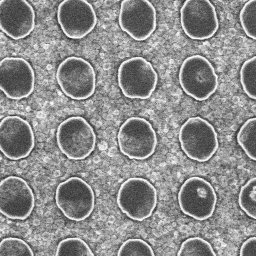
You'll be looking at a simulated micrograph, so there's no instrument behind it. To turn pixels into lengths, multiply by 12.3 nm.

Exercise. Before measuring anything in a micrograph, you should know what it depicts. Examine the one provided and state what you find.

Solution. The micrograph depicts a regular array of raised bodies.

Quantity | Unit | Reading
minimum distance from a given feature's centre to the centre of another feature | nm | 739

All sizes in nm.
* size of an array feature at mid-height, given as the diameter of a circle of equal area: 488